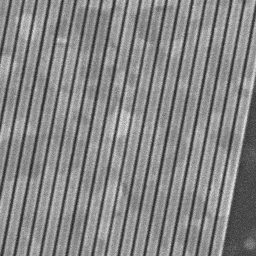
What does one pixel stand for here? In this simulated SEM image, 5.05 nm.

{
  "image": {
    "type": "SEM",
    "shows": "parallel lines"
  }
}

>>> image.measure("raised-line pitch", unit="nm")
64.4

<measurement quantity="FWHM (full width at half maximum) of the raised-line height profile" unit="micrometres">0.0483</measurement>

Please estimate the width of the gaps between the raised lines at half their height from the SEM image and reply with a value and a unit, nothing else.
19.2 nm